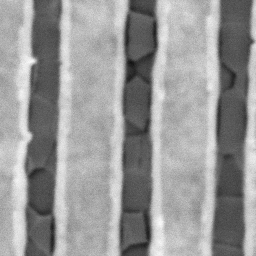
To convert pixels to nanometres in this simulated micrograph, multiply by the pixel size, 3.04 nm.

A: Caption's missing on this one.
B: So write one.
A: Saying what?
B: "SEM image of one or a few lines or trenches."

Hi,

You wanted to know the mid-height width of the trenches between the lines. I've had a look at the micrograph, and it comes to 112 nanometers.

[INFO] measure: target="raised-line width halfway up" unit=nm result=174